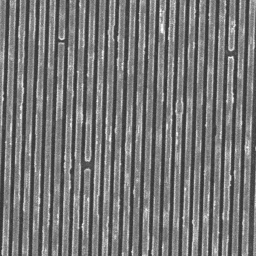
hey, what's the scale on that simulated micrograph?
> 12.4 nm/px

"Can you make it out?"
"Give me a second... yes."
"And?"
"parallel lines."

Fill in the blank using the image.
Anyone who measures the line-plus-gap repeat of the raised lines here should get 124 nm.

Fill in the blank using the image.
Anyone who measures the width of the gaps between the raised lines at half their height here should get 0.0528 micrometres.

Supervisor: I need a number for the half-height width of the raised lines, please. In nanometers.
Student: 73.1